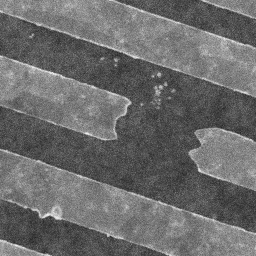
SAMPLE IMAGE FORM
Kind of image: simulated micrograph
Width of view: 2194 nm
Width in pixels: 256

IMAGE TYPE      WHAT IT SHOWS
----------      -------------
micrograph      one or a few lines or trenches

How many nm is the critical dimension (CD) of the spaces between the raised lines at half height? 352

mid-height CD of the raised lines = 401 nm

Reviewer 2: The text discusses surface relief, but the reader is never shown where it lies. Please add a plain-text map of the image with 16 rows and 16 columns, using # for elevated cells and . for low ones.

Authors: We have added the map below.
########......##
..#########.....
.....#########..
........########
###........#####
######........##
########........
...####.........
......#.....###.
#...........####
####........####
#######........#
##########......
...##########...
......##########
##.......#######